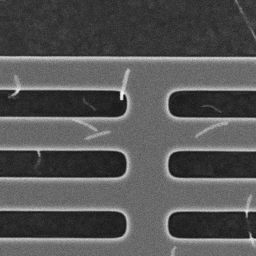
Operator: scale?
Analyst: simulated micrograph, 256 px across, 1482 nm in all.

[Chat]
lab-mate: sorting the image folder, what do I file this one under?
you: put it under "groups of lines, slits or small figures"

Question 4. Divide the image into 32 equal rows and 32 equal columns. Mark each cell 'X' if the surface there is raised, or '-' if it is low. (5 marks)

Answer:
--------------------------------
--------------------------------
--------------------------------
--------------------------------
--------------------------------
--------------------------------
--------------------------------
XXXXXXXXXXXXXXXXXXXXXXXXXXXXXXXX
XXXXXXXXXXXXXXXXXXXXXXXXXXXXXXXX
XXXXXXXXXXXXXXXXXXXXXXXXXXXXXXXX
XXXXXXXXXXXXXXXXXXXXXXXXXXXXXXXX
---------------XXXXXXX----------
----------------XXXXX-----------
----------------XXXXX-----------
---------------XXXXXXX----------
XXXXXXXXXXXXXXXXXXXXXXXXXXXXXXXX
XXXXXXXXXXXXXXXXXXXXXXXXXXXXXXXX
XXXXXXXXXXXXXXXXXXXXXXXXXXXXXXXX
XXXXXXXXXXXXXXXXXXXXXXXXXXXXXXXX
----------------XXXXX-----------
----------------XXXXX-----------
----------------XXXXX-----------
XXXXXXXXXXXXXXXXXXXXXXXXXXXXXXXX
XXXXXXXXXXXXXXXXXXXXXXXXXXXXXXXX
XXXXXXXXXXXXXXXXXXXXXXXXXXXXXXXX
XXXXXXXXXXXXXXXXXXXXXXXXXXXXXXXX
---------------XXXXXXX--------X-
----------------XXXXX-----------
----------------XXXXX-----------
---------------XXXXXXX----------
XXXXXXXXXXXXXXXXXXXXXXXXXXXXXXXX
XXXXXXXXXXXXXXXXXXXXXXXXXXXXXXXX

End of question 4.